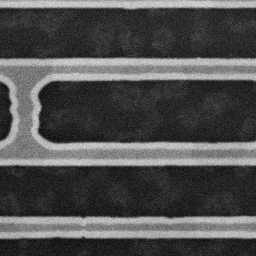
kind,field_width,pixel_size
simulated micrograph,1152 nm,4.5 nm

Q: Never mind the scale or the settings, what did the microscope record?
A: one or a few lines or trenches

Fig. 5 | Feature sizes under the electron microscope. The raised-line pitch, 354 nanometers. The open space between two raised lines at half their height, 263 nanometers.